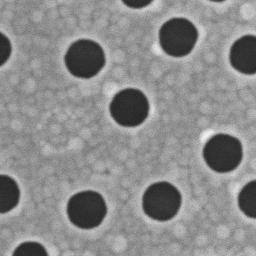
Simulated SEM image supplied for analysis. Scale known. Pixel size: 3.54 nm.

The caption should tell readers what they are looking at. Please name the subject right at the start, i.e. holes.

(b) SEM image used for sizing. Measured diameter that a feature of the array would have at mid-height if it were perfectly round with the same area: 141 nanometers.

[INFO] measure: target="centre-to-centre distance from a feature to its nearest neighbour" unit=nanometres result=267